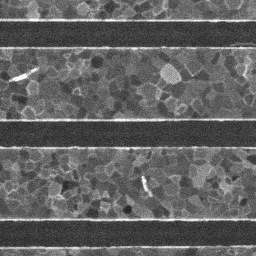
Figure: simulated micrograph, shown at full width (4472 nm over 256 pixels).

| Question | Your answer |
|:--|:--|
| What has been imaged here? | lines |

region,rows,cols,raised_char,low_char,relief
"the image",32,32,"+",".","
++++++++++++++++++++++++++++++++
++++++++++++++++++++++++++++++++
++++++++++++++++++++++++++++++++
................................
................................
................................
++++++++++++++++++++++++++++++++
++++++++++++++++++++++++++++++++
++++++++++++++++++++++++++++++++
++++++++++++++++++++++++++++++++
++++++++++++++++++++++++++++++++
++++++++++++++++++++++++++++++++
++++++++++++++++++++++++++++++++
++++++++++++++++++++++++++++++++
++++++++++++++++++++++++++++++++
................................
................................
................................
++++++++++++++++++++++++++++++++
++++++++++++++++++++++++++++++++
++++++++++++++++++++++++++++++++
++++++++++++++++++++++++++++++++
++++++++++++++++++++++++++++++++
++++++++++++++++++++++++++++++++
++++++++++++++++++++++++++++++++
++++++++++++++++++++++++++++++++
++++++++++++++++++++++++++++++++
................................
................................
................................
................................
++++++++++++++++++++++++++++++++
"